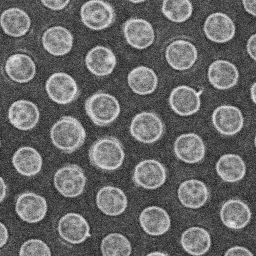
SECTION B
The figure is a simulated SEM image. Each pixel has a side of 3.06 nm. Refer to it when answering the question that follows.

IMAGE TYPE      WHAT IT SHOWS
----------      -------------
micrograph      a regular array of raised bodies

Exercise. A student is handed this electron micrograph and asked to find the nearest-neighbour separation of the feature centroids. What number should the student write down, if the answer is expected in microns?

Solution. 0.141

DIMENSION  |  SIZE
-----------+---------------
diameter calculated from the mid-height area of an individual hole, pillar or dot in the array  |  87.9 nm